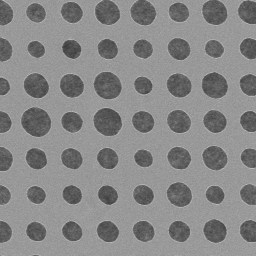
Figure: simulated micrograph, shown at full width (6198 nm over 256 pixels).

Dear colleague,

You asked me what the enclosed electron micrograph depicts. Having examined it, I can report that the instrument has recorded a regular array of holes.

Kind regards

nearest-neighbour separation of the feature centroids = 861 nm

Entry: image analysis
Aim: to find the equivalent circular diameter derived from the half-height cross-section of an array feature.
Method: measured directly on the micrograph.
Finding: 524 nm